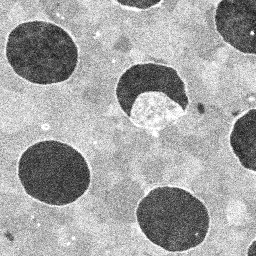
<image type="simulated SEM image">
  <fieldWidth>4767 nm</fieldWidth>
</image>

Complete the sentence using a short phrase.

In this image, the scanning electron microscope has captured holes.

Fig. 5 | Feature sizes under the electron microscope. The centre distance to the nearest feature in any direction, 2180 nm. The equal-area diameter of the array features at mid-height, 1290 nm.